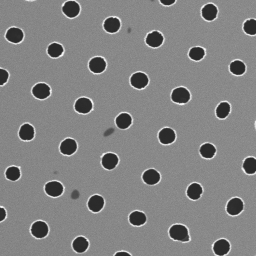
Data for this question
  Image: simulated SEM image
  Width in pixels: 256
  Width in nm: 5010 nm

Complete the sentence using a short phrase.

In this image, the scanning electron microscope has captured a regular array of holes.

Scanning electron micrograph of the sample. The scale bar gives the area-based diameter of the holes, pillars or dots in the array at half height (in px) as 16.5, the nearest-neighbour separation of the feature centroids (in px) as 43.2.